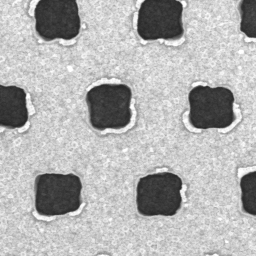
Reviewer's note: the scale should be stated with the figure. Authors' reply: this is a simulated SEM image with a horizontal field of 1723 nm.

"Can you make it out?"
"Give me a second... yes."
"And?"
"holes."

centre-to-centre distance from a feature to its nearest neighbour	0.682	micrometres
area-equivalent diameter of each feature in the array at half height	319	nm